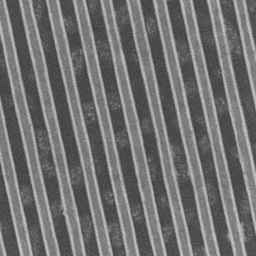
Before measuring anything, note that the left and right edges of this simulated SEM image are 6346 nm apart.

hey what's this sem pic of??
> parallel lines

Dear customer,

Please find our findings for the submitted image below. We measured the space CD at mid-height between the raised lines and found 16.1 pixels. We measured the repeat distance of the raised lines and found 26.1 px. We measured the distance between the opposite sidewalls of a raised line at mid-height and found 242 nm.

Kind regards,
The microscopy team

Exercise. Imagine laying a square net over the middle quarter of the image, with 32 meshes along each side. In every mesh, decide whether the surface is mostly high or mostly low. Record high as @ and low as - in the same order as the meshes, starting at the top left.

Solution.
@@----@@@----@@----@@@----@@----
@@----@@@----@@-----@@----@@@---
@@----@@@----@@@----@@----@@@---
@@-----@@----@@@----@@@----@@---
@@@----@@-----@@----@@@----@@---
-@@----@@@----@@-----@@----@@@--
-@@----@@@----@@-----@@----@@@--
-@@-----@@----@@@----@@-----@@--
-@@-----@@----@@@----@@@----@@--
-@@@----@@-----@@-----@@----@@--
--@@----@@@----@@-----@@----@@@-
--@@----@@@----@@@----@@----@@@-
--@@-----@@----@@@----@@-----@@-
--@@-----@@-----@@----@@@----@@-
--@@@----@@-----@@-----@@----@@-
---@@----@@@----@@@----@@----@@@
---@@-----@@----@@@----@@----@@@
---@@@----@@----@@@----@@-----@@
---@@@----@@-----@@----@@@----@@
----@@----@@-----@@-----@@----@@
----@@----@@@----@@@----@@----@@
----@@-----@@----@@@----@@----@@
----@@@----@@----@@@----@@@----@
----@@@----@@-----@@----@@@----@
-----@@----@@-----@@@----@@----@
-----@@----@@@----@@@----@@-----
@----@@----@@@----@@@----@@-----
@----@@-----@@----@@@----@@-----
@----@@@----@@----@@@----@@@----
@-----@@----@@-----@@@----@@----
@-----@@----@@@----@@@----@@----
@@----@@----@@@----@@@----@@----